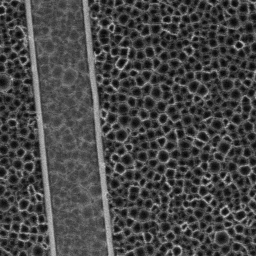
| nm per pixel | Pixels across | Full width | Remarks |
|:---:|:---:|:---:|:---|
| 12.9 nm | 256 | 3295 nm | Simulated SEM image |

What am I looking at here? one or a few lines or trenches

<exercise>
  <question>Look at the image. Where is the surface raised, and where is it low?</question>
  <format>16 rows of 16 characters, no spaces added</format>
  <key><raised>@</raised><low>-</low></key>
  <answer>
@@---@@@@@@@@@@@
@@---@@@@@@@@@@@
@@----@@@@@@@@@@
@@----@@@@@@@@@@
@@----@@@@@@@@@@
@@----@@@@@@@@@@
@@----@@@@@@@@@@
@@----@@@@@@@@@@
@@@---@@@@@@@@@@
@@@---@@@@@@@@@@
@@@---@@@@@@@@@@
@@@---@@@@@@@@@@
@@@----@@@@@@@@@
@@@----@@@@@@@@@
@@@----@@@@@@@@@
@@@----@@@@@@@@@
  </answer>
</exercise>